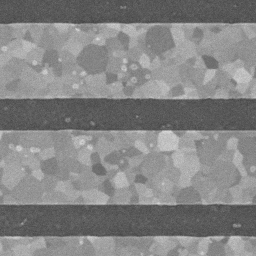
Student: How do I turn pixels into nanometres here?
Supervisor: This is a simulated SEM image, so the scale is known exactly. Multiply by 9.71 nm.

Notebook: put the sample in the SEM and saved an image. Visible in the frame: lines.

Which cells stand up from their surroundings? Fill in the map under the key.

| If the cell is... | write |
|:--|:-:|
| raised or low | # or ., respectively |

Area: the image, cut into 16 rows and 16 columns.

................
################
################
################
################
################
................
................
################
################
################
################
################
................
................
################